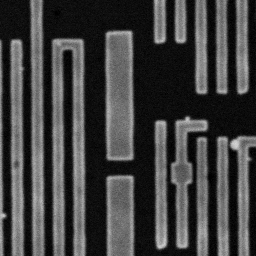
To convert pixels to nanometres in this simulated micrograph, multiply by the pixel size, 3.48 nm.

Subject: wiring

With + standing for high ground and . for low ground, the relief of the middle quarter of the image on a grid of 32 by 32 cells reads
..+++......++++++...............
..+++......++++++...............
..+++......++++++...............
..+++......++++++...............
..+++......++++++...............
..+++......++++++...............
..+++......++++++...............
..+++......++++++...............
..+++......++++++...............
..+++......++++++...............
..+++......++++++...............
..+++......++++++...............
..+++......++++++...............
..+++......++++++...............
..+++......++++++......++...++++
...++......++++++......++...++++
..+++......++++++......++...++++
..+++......++++++......++...+++.
..+++......++++++......++...+++.
..+++......++++++......++...+++.
..+++......++++++......++...+++.
...++......++++++......++...+++.
...++......++++++......++...+++.
...++......++++++......++...+++.
...++..................++...+++.
...++..................++..+++++
...++..................++..+++++
...++..................++..+++++
...++......++++++......++..+++++
...++......++++++......++..+++++
...++......++++++......++...+++.
...++......++++++......++...+++.